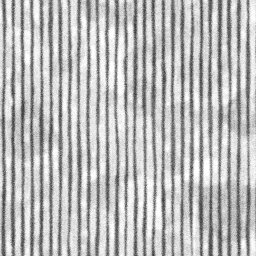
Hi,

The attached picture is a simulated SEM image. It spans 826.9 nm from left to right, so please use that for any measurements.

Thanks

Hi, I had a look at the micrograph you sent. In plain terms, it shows parallel lines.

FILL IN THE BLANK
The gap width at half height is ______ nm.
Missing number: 14.6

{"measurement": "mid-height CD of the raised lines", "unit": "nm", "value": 14.6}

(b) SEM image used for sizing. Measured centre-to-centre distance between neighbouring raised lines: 30.4 nm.